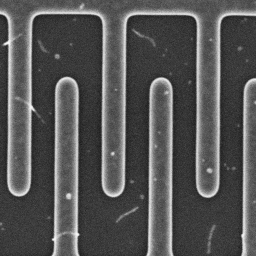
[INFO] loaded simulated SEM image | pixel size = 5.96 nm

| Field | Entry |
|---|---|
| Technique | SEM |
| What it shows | groups of lines, slits or small figures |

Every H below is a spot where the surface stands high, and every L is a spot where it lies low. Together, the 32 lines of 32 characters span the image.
HHHHHHHHHHHHHHHHHHHHHHHHHHHHHHHH
HHHHHHHHHHHHHHHHHHHHHHHHHHHHHHHH
LHHHLLLLLLLLLHHHLLLLLLLLLHHHLLLL
LHHHLLLLLLLLLHHHLLLLLLLLLHHLLLLL
LHHHLLLLLLLLLHHHLLLLLLLLLHHLLLLL
LHHHLLLLLLLLLHHHLLLLLLLLLHHLLLLL
LHHHLLLLLLLLLHHHLLLLLLLLLHHLLLLL
LHHHLLLLLLLLLHHHLLLLLLLLLHHLLLLL
LHHHLLLLLLLLLHHHLLLLLLLLLHHLLLLL
LHHHLLLLLLLLLHHHLLLLLLLLLHHLLLLL
LHHHLLLHHHLLLHHHLLLHHLLLLHHLLLLH
LHHHLLLHHHLLLHHHLLLHHLLLLHHLLLLH
LHHHLLLHHHLLLHHHLLLHHLLLLHHLLLLH
LHHHLLLHHHLLLHHHLLLHHLLLLHHLLLLH
LHHHLLLHHHLLLHHHLLLHHLLLLHHLLLLH
LHHHLLLHHHLLLHHHLLLHHLLLLHHLLLLH
LHHHLLLHHHLLLHHHLLLHHLLLLHHLLLHH
LHHHLLLHHHLLLHHHLLLHHLLLLHHLLLHH
LHHHLLLHHHLLLHHHLLLHHLLLLHHLLLHH
LHHHLLLHHHLLLHHHLLLHHLLLLHHLLLHH
LHHHLLLHHHLLLHHHLLLHHLLLLHHLLLHH
LHHHLLLHHHLLLHHHLLLHHLLLLHHLLLHH
LHHHLLLHHHLLLHHHLLLHHLLLLHHLLLHH
LHHHLLLHHHLLLHHLLLLHHLLLLHHLLLHH
LLLLLLLHHHLLLLLLLLLHHLLLLHLLLLHH
LLLLLLLHHHLLLLLLLLLHHLLLLLLLLLHH
LLLLLLLHHHLLLLLLLLLHHLLLLLLLLLHH
LLLLLLLHHHLLLLLLLLLHHLLLLLLLLLHH
LLLLLLLHHHLLLLLLLLLHHLLLLLLLLLHH
LLLLLLLHHHLLLLLLLLLHHLLLLLLLLLHH
LLLLLLLHHHLLLLLLLLLHHLLLLLLLLLHH
LLLLLLLHHHLLLLLLLLHHHHLLLLLLLLHH